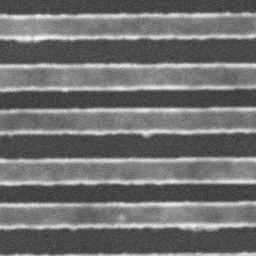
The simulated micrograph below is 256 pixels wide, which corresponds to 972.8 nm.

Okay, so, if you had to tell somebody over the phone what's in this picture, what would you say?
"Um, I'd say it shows lines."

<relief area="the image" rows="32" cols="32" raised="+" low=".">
................................
................................
++++++++++++++++++++++++++++++++
++++++++++++++++++++++++++++++++
++++++++++++++++++++++++++++++++
................................
................................
................................
++++++++++++++++++++++++++++++++
++++++++++++++++++++++++++++++++
++++++++++++++++++++++++++++++++
................................
................................
................................
++++++++++++++++++++++++++++++++
++++++++++++++++++++++++++++++++
+++++++++++++++++++++++++++++++.
................................
................................
................................
++++++++++++++++++++++++++++++++
++++++++++++++++++++++++++++++++
++++++++++++++++++++++++++++++++
................................
................................
.............+++.+++++++++++++++
++++++++++++++++++++++++++++++++
++++++++++++++++++++++++++++++++
++..+++..+......................
................................
................................
................................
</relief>